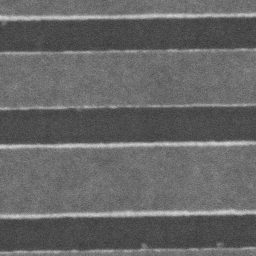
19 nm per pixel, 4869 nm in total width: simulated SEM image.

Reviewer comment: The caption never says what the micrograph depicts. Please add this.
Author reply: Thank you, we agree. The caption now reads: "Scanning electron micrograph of lines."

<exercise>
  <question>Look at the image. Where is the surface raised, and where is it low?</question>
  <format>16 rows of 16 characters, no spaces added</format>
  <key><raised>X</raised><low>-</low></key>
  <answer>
XXXXXXXXXXXXXXXX
----------------
----------------
XXXXXXXXXXXXXXXX
XXXXXXXXXXXXXXXX
XXXXXXXXXXXXXXXX
XXXXXXXXXXXXXXXX
----------------
----------------
XXXXXXXXXXXXXXXX
XXXXXXXXXXXXXXXX
XXXXXXXXXXXXXXXX
XXXXXXXXXXXXXXXX
XXXXX-----------
----------------
----------------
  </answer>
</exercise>